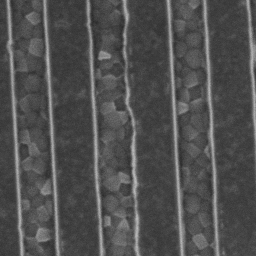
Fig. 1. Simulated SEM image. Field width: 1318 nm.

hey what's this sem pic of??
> one or a few lines or trenches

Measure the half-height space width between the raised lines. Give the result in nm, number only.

188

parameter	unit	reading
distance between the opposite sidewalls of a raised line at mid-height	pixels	43.2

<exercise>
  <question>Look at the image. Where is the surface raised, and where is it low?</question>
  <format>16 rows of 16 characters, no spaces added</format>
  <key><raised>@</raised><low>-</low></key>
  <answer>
@--@@@--@@@--@@@
@--@@@--@@@--@@@
@--@@@--@@@--@@@
@--@@@--@@@--@@@
@--@@@--@@@--@@@
@--@@@--@@@--@@@
@--@@@--@@@--@@@
@--@@@--@@@--@@@
@--@@@--@@@--@@@
@--@@@--@@@--@@@
@--@@@--@@@--@@@
@--@@@--@@@--@@@
@--@@@--@@@--@@@
@---@@---@@--@@@
@---@@---@@---@@
@---@@---@@---@@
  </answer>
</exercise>